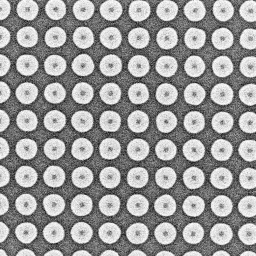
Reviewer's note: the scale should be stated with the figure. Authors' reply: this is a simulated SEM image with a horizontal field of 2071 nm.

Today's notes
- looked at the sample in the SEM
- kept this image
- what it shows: an array of small figures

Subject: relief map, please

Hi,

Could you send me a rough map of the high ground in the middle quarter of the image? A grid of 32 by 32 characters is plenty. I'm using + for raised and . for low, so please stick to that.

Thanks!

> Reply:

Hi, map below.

..+++++..+++++..+++++..+++++..++
..+++++..+++++..+++++..+++++..++
...+++....+++....+++....+++....+
................................
................................
...+++....++++...+++....+++....+
..+++++..+++++..+++++..+++++..++
..+++++..+++++..+++++..+++++..++
..+++++..+++++..+++++..+++++..++
...+++....+++....+++....+++....+
................................
................................
...++++...+++....+++....+++....+
..+++++..+++++..+++++..+++++..++
..+++++..+++++..+++++..+++++..++
..+++++..+++++..+++++..+++++..++
...+++....+++....+++....+++....+
................................
................................
...+++....++++...+++....+++....+
..+++++..+++++..+++++..+++++..++
..+++++..+++++..+++++..+++++..++
..+++++..+++++..+++++..+++++..++
...+++....+++....+++....+++....+
................................
................................
...+++....+++....+++....+++....+
..+++++..+++++..+++++..+++++..++
..+++++..+++++..+++++..+++++..++
..+++++..+++++..+++++..+++++..++
...+++....+++....+++....+++....+
................................